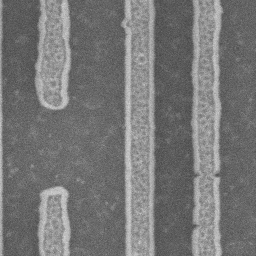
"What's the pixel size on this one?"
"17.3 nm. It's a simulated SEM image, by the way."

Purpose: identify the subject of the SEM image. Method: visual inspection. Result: one or a few lines or trenches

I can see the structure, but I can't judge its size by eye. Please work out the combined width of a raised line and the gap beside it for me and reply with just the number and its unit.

1270 nm